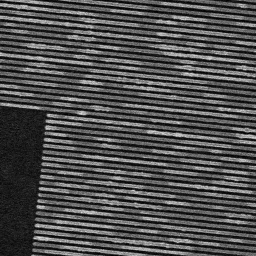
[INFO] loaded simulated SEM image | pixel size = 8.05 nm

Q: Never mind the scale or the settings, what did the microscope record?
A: parallel lines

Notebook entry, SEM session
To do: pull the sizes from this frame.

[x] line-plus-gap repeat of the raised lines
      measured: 0.0496 um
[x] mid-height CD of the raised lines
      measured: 27.1 nm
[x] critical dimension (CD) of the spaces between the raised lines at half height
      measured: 0.0271 microns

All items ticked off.